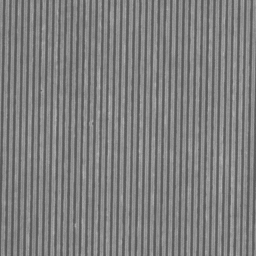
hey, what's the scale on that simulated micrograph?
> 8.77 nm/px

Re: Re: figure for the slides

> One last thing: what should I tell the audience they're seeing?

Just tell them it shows parallel lines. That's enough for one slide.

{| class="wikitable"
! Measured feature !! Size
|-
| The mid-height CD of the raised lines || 24.1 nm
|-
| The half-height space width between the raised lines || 31.8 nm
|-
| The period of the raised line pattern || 54.2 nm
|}